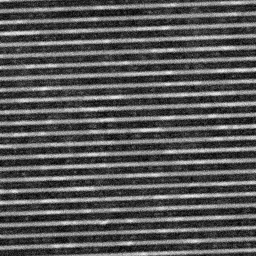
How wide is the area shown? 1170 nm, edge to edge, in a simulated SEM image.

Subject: parallel lines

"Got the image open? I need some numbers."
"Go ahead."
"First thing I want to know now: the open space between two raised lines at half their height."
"34.9 nanometres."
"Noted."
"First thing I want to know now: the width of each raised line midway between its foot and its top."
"13.1 nanometres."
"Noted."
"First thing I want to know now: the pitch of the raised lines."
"11.3 pixels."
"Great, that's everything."